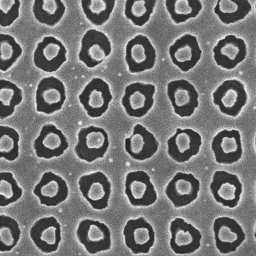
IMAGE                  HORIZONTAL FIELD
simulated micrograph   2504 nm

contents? a regular array of ring-shaped grooves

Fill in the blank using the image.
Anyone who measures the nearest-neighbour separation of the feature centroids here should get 425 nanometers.